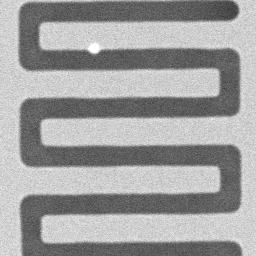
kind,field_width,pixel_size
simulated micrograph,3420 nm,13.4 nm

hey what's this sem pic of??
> groups of lines, slits or small figures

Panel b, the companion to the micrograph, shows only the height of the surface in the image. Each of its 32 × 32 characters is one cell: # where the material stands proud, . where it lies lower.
###...........................##
##............................##
##...........................###
##...###########################
##...###########################
##...###########################
##............................##
##............................##
###...........................##
###########################...##
###########################...##
###########################...##
###...........................##
##............................##
##...........................###
##...###########################
##...###########################
##...###########################
##............................##
##............................##
###...........................##
###########################...##
###########################...##
###########################...##
###...........................##
##............................##
##............................##
##...###########################
##...###########################
###..###########################
###...........................##
###...........................##